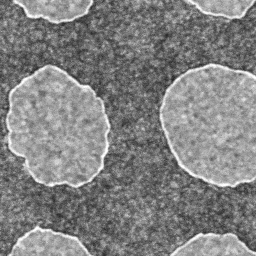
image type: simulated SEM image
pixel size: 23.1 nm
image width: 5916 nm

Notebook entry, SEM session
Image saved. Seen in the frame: raised bodies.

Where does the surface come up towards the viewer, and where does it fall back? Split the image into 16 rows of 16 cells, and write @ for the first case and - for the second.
-@@@@@------@@@@
----------------
----------------
----------------
--@@--------@@@-
-@@@@@-----@@@@@
-@@@@@----@@@@@@
@@@@@@@---@@@@@@
-@@@@@@---@@@@@@
-@@@@@@----@@@@@
--@@@@-----@@@@@
---@@--------@@-
----------------
----------------
--@-------------
-@@@@------@@@@-